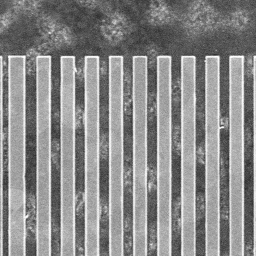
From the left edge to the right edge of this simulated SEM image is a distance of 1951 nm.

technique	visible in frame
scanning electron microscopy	parallel lines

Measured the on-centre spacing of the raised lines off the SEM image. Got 186 nm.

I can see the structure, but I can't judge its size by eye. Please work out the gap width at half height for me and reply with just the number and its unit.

85.8 nanometres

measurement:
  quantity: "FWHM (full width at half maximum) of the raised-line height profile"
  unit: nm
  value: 97.2